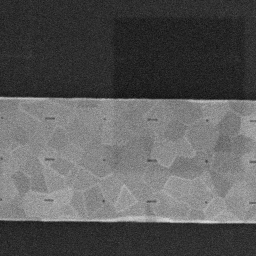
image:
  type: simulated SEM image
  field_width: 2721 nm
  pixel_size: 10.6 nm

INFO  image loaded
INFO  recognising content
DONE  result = wiring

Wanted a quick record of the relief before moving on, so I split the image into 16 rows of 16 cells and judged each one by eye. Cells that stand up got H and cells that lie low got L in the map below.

LLLLLLLLLLLLLLLL
LLLLLLLLLLLLLLLL
LLLLLLLLLLLLLLLL
LLLLLLLLLLLLLLLL
LLLLLLLLLLLLLLLL
LLLLLLLLLLLLLLLL
HHHHHHHHHHHHHHHH
HHHHHHHHHHHHHHHH
HHHHHHHHHHHHHHHH
HHHHHHHHHHHHHHHH
HHHHHHHHHHHHHHHH
HHHHHHHHHHHHHHHH
HHHHHHHHHHHHHHHH
HHHHHHHHHHHHHHHH
LLLLLLLLLLLLLLLL
LLLLLLLLLLLLLLLL